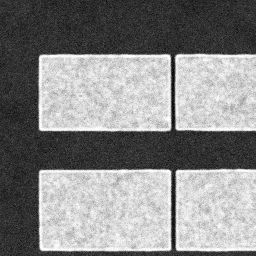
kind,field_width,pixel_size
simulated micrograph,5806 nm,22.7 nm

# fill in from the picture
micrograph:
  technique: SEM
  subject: wiring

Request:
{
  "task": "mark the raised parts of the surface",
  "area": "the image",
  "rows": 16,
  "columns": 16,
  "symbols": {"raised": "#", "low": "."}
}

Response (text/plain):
................
................
................
...#####...###.#
...#############
..##############
..##############
...#############
................
................
................
...#############
...#############
...#############
...#############
...#######.#####